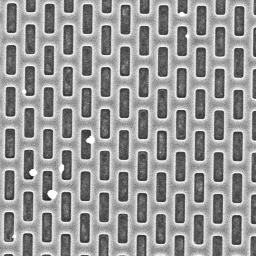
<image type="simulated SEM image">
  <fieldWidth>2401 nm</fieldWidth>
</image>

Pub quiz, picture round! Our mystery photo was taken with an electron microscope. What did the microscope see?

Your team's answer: groups of lines, slits or small figures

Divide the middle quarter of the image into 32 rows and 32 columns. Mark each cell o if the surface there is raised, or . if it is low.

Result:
oooo...ooooooo...oooooo...oooooo
..oo...oo...oo...oo..oo...oo...o
..ooo..oo...oo..oo...oo...oo...o
..ooooooo...oooooo...ooooooo...o
..ooooooo...oooooo...ooooooo...o
..ooooooo...oooooo...ooooooo...o
..ooo..oo...oo..oo...oo...oo...o
..oo...oo...oo..oo...oo...oo...o
oooo...ooooooo..ooo.ooo...ooo.oo
oooo...ooooooo..ooooooo...oooooo
oooo...ooooooo..ooooooo...oooooo
..oo...oo..ooo..ooo..oo...ooo.oo
..oo...oo...oo..oo...oo...oo...o
..ooooooo...oo..oo...ooo.ooo...o
..ooooooo...oooooo...ooooooo...o
..ooooooo...oooooo...ooooooo...o
..ooo.ooo...oo..oo...ooooooo...o
..oo...oo...oo..oo...oo...oo...o
..oo..ooo..oo...ooo..oo...oo..oo
oooo..ooooooo...ooooooo...oooooo
oooo...oooooo...ooooooo...oooooo
.ooo...oooooo...ooooooo...oooooo
..oo...oo..oo...oo...oo...oo...o
..oo...oo..ooo..oo...oo...oo...o
..ooooooo..ooooooo...ooooooo...o
..ooooooo..ooooooo...ooooooo...o
..ooooooo..ooooooo...ooooooo...o
..oo...oo..ooo..oo...oo...oo...o
..oo...oo..oo...oo...oo...oo..oo
oooo...oooooo...ooooooo...oooooo
oooo...oooooo...ooooooo...oooooo
oooo...oooooo...ooooooo...oooooo